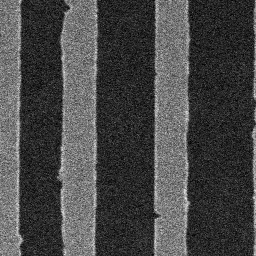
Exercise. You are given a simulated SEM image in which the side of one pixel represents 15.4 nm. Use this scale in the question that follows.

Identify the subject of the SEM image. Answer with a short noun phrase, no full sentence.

one or a few lines or trenches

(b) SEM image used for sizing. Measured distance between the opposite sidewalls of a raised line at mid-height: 479 nanometres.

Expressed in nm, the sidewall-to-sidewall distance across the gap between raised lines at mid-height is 941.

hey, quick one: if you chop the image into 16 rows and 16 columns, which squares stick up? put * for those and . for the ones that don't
*...**....**....
*...**....**....
*...**....**....
*...**....**....
*...**....**....
*...**....**....
*...**....**....
*...**....**....
*...**....**....
*...**....**....
*...**....**....
*...**....**....
*...**....**....
*...**....**....
*...**....**....
*...**....**....